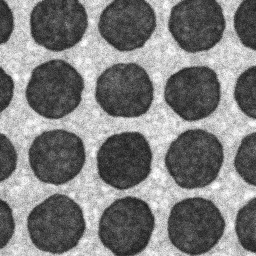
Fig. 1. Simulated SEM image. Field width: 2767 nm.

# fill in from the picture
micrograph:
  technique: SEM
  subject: holes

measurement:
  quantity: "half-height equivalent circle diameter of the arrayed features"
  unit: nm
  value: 628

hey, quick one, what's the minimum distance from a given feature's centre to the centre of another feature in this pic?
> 730 nm